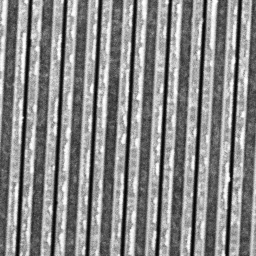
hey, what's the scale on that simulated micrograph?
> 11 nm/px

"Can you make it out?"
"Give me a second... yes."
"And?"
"parallel lines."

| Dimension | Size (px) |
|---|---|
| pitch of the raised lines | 17.1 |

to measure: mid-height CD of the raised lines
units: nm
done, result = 107